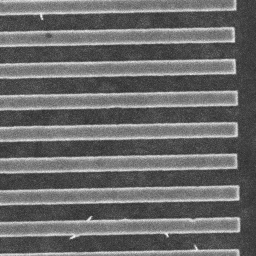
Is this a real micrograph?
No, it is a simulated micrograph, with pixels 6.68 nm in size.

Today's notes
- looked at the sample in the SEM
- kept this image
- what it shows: parallel lines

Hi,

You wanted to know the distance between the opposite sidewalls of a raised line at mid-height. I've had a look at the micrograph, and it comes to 94.3 nm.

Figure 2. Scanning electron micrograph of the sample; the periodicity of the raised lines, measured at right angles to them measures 31.7 pixels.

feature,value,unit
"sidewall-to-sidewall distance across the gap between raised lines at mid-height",118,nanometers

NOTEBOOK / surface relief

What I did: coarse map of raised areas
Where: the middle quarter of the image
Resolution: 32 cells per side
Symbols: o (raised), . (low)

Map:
oooooooooooooooooooooooooooooooo
oooooooooooooooooooooooooooooooo
oooooooooooooooooooooooooooooo.o
................................
................................
................................
................................
..............oooooooooooooooooo
oooooooooooooooooooooooooooooooo
oooooooooooooooooooooooooooooooo
oooooooooooooooooooooooooooo....
................................
................................
................................
................................
..oooooooooooooooooooooooooooooo
oooooooooooooooooooooooooooooooo
oooooooooooooooooooooooooooooooo
oooooooooooooooooo..oooooo......
................................
................................
................................
................................
oooooooooooooooooooooooooooooooo
oooooooooooooooooooooooooooooooo
oooooooooooooooooooooooooooooooo
oooooooooooooooo...o............
................................
................................
................................
................................
oooooooooooooooooooooooooooooooo